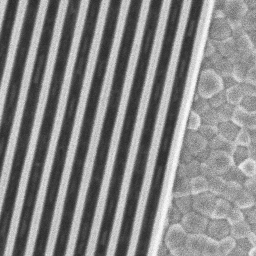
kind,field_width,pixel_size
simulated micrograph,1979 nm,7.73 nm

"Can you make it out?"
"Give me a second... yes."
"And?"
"parallel lines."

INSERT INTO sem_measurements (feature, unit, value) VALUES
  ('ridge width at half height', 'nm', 69.8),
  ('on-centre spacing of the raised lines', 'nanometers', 155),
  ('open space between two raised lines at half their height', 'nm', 83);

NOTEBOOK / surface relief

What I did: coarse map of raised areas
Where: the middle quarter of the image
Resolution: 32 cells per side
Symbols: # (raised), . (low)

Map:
###...##...##...##...##...##...#
##...###...##...##...##...##...#
##...##...###..###..###...##...#
##...##...##...##...###..###...#
##...##...##...##...##...##...##
##..###..###...##...##...##...##
#...##...###...##...##...##...##
#...##...##...###..###..###...##
#...##...##...##...###..###..###
#...##...##...##...##...##...##.
#..##...###...##...##...##...##.
...##...###..###..###...##...##.
...##...##...##...##...###...##.
...##...##...##...##...###..###.
..###..###...##...##...##...##..
..##...###...##...##...##...##..
..##...##...##...###..###...##..
..##...##...##...##...###..###..
.###...##...##...##...##...##...
.##...###...##...##...##...##...
.##...###..###..###...##...##...
.##...##...##...##...###..###...
.##...##...##...##...###..##....
###..###...##...##...##...##....
##...###..###...##...##...##....
##...##...##...###..###..###....
##...##...##...##...###..###....
##...##...##...##...##...##.....
#...###...##...##...##...##.....
#...###..###..###...##...##.....
#...##...##...##...###...##.....
#...##...##...##...##...###.....